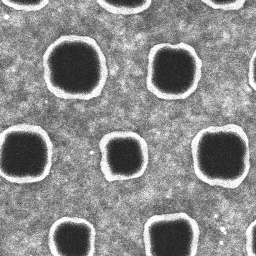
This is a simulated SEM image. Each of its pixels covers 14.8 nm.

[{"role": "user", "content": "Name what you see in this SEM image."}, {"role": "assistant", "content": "raised bodies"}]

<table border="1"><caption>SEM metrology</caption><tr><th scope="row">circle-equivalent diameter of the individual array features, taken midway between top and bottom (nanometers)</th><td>826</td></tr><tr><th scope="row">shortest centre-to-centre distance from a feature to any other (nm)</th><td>1440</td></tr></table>